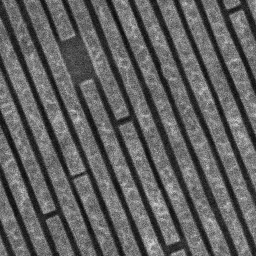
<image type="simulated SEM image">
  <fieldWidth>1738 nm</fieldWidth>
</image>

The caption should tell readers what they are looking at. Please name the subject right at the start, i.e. parallel lines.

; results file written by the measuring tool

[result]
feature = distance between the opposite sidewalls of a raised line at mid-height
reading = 0.0975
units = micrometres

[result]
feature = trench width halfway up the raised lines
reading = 0.0449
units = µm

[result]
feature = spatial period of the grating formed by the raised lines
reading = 140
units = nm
